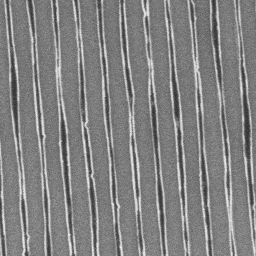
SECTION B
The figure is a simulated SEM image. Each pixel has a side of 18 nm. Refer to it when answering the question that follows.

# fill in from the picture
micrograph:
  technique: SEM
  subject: parallel lines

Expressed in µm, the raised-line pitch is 0.412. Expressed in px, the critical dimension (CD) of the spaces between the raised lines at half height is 17.7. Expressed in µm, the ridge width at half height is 0.106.